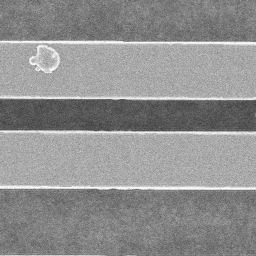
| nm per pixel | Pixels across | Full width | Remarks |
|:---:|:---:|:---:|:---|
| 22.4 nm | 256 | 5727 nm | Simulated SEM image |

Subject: lines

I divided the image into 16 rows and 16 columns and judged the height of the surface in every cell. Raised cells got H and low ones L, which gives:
LLLLLLLLLLLLLLLL
LLLLLLLLLLLLLLLL
LLLLLLLLLLLLLLLL
HHHHHHHHHHHHHHHH
HHHHHHHHHHHHHHHH
HHHHHHHHHHHHHHHH
LLLLLLLLLLLLLLLL
LLLLLLLLLLLLLLLL
HHHHHHHHHHHHHHHH
HHHHHHHHHHHHHHHH
HHHHHHHHHHHHHHHH
HHHHHHHHHHHHHHHH
LLLLLLLLLLLLLLLL
LLLLLLLLLLLLLLLL
LLLLLLLLLLLLLLLL
LLLLLLLLLLLLLLLL